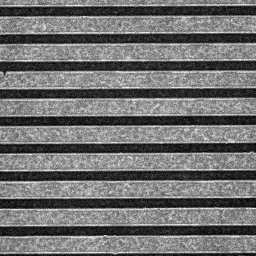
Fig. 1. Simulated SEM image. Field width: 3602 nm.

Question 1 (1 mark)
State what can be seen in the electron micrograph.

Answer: parallel lines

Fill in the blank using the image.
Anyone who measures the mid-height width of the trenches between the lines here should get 150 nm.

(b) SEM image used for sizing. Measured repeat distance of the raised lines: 27.4 px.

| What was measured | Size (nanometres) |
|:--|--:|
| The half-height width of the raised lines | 237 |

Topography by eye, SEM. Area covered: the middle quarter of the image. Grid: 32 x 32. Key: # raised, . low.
................................
................................
################################
################################
################################
################################
................................
................................
................................
################################
################################
################################
################################
................................
................................
................................
################################
################################
################################
################################
................................
................................
..............#.....############
################################
################################
################################
##########......................
................................
................................
################################
################################
################################